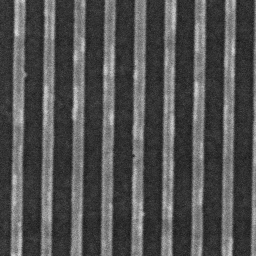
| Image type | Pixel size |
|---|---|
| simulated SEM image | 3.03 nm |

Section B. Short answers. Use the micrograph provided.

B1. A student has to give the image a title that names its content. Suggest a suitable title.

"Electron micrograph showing parallel lines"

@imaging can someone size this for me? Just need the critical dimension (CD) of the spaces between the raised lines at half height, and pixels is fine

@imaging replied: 20.9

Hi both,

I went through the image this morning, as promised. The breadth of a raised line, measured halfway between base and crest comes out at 26.5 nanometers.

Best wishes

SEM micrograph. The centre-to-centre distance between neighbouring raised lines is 91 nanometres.